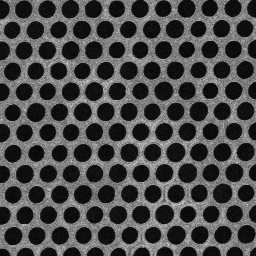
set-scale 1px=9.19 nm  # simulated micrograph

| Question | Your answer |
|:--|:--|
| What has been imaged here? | a regular array of holes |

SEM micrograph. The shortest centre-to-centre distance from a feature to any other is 213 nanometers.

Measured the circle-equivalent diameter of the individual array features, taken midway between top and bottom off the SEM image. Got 159 nanometers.